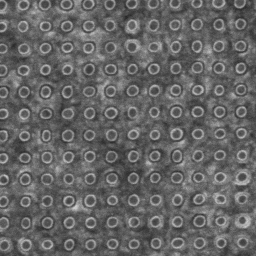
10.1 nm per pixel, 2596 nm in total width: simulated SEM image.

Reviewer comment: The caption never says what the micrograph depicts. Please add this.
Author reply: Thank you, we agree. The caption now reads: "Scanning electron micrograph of a regular array of raised bodies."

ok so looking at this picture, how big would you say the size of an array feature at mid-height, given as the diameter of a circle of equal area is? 102 nm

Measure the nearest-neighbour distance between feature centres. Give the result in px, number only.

21.4